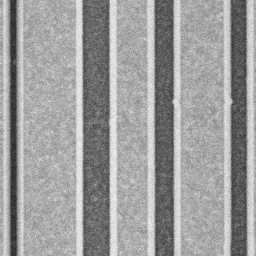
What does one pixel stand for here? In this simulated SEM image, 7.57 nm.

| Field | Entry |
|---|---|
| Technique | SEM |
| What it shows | one or a few lines or trenches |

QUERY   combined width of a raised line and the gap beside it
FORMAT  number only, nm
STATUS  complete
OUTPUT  578